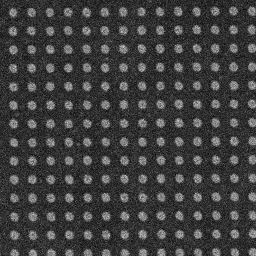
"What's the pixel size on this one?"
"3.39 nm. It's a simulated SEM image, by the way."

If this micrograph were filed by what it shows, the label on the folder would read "a regular array of raised bodies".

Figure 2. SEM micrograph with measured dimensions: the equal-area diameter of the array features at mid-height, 27.3 nanometres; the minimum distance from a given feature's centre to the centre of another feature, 61 nm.